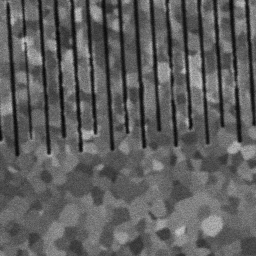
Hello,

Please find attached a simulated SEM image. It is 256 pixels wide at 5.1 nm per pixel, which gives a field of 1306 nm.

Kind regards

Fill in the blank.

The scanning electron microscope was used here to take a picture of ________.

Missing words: parallel lines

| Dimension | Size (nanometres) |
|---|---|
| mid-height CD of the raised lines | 57.9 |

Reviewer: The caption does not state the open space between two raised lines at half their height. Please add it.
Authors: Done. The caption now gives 0.0242 µm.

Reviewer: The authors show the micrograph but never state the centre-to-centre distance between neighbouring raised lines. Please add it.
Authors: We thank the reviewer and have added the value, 81.2 nm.